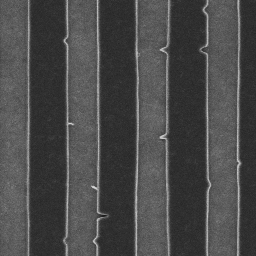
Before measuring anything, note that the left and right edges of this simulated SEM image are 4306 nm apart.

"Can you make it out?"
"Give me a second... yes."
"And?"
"one or a few lines or trenches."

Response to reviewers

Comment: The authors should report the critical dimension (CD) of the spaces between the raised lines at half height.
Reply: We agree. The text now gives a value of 503 nm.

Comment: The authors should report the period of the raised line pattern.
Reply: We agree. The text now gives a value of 1.17 micrometres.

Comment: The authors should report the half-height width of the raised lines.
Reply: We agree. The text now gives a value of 667 nanometers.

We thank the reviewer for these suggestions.